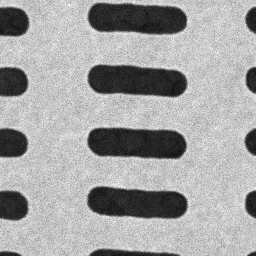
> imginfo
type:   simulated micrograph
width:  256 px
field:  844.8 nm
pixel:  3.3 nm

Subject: holes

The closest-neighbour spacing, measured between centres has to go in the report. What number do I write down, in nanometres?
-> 202